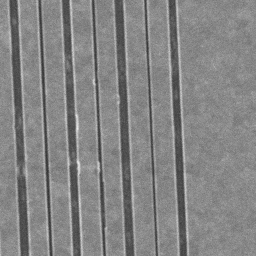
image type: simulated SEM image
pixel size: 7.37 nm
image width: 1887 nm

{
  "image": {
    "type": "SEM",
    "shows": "parallel lines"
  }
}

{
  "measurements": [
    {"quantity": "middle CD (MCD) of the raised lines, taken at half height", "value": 146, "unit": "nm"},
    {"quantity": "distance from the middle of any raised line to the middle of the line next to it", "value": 190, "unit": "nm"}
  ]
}